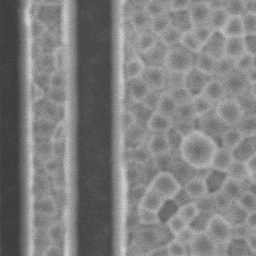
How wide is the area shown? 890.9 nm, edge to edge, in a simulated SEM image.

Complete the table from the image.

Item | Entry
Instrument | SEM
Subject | one or a few lines or trenches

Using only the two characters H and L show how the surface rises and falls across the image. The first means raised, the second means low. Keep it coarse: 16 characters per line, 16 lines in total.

LHHHLLLHHHHHHHHH
LHHHLLLHHHHHHHHH
LLHHLLLHHHHHHHHH
LHHHHLLHHHHHHHHH
LHHHHLLHHHHHHHHH
LLHHLLLHHHHHHHHH
LLHHHLLHHHHHHHHH
LHHHHLLHHHHHHHHH
LLHHLLLHHHHHHHHH
LLHHLLLHHHHHHHHH
LLHHLLLHHHHHHHHH
LLHHLLLHHHHHHHHH
LLHHLLLHHHHHHHHH
LLHHHLLHHHHHHHHH
LLHHHLLHHHHHHHHH
LLHHHLLHHHHHHHHH